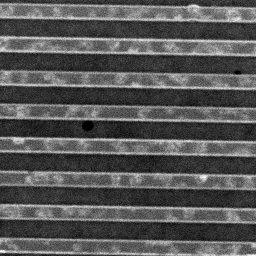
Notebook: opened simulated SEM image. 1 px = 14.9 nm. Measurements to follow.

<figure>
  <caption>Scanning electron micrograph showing parallel lines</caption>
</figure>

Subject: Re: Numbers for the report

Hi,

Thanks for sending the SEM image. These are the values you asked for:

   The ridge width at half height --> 205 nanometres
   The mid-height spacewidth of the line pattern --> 296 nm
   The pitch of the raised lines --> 499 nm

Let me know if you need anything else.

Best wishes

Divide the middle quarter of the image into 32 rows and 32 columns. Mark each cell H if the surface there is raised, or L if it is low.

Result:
LLLLLLLLLLLLLLLLLLLLLLLLLLLLLLLL
LLLLLLLLLLLLLLLLLLLLLLLLLLLLLLLL
HHHHHHHHHHHHHHHHHHHHHHLLLLLLLLLL
HHHHHHHHHHHHHHHHHHHHHHHHHHHHHHHH
HHHHHHHHHHHHHHHHHHHHHHHHHHHHHHHH
LLLLLLLLHHHHHHHHHHHHHHHHHHHHHHHH
LLLLLLLLLLLLLLLLLLLLLLLLLLLLLLLL
LLLLLLLLLLLLLLLLLLLLLLLLLLLLLLLL
LLLLLLLLLLLLLLLLLLLLLLLLLLLLLLLL
LLLLLLLLLLLLLLLLLLLLLLLLLLLLLLLL
HLLLLLHLLLLLLLLLLLLLLLLLLLLLLLLL
HHHHHHHHHHHHHHHHHHHHHHHHHHHHHHHH
HHHHHHHHHHHHHHHHHHHHHHHHHHHHHHHH
HHHHHHHHHHHHHHHHHHHHHHHHHHHHHHHH
LLLLLLLLLLLLLLLLLLLLLLLLLLLLLLLL
LLLLLLLLLLLLLLLLLLLLLLLLLLLLLLLL
LLLLLLLLLLLLLLLLLLLLLLLLLLLLLLLL
LLLLLLLLLLLLLLLLLLLLLLLLLLLLLLLL
LLLLLLLLLLLLLLLLLLLLLLLLLLLLLLLL
HHHHHHHHHHHHHHHHHHHHHHHHHHHHHHHH
HHHHHHHHHHHHHHHHHHHHHHHHHHHHHHHH
HHHHHHHHHHHHHHHHHHHHHHHHHHHHHHHH
LLLLLLLLLLLLLLLLLLLLLLLLLLLLLHHH
LLLLLLLLLLLLLLLLLLLLLLLLLLLLLLLL
LLLLLLLLLLLLLLLLLLLLLLLLLLLLLLLL
LLLLLLLLLLLLLLLLLLLLLLLLLLLLLLLL
LLLLLLLLLLLLLLLLLLLLLLLLLLLLLLLL
HHHHHHHHHHHHHHHHHLLLLLLLLLLLLLLL
HHHHHHHHHHHHHHHHHHHHHHHHHHHHHHHH
HHHHHHHHHHHHHHHHHHHHHHHHHHHHHHHH
LLLHHHHHHHHHHHHHHHHHHHHHHHHHHHHH
LLLLLLLLLLLLLLLLLLLLLLLLLLLLLLLL